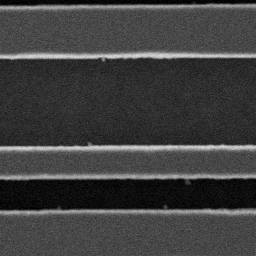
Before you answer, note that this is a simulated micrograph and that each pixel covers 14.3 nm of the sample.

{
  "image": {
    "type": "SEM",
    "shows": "lines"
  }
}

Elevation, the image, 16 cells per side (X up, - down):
XXXXXXXXXXXXXXXX
XXXXXXXXXXXXXXXX
XXXXXXXXXXXXXXXX
XXXXXXXXXXXXXXXX
----------------
----------------
----------------
----------------
----------------
XXXXXXXXXXXXXXXX
XXXXXXXXXXXXXXXX
----------------
----------------
XXXXXXXXXXXXXXXX
XXXXXXXXXXXXXXXX
XXXXXXXXXXXXXXXX